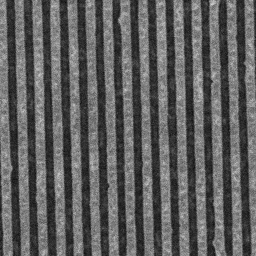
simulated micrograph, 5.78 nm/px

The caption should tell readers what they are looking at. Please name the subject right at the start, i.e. parallel lines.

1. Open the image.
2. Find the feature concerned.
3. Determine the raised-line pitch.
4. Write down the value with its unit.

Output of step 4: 0.102 µm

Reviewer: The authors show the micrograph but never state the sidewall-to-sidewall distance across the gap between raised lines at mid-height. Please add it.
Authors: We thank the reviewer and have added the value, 0.0527 µm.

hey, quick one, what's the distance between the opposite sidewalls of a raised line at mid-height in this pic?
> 48.4 nm